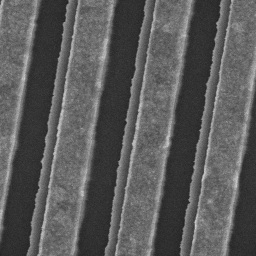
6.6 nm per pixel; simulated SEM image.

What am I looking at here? lines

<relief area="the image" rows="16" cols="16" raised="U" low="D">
UUDDUUUDDUUUDDUU
UUDDUUUDDUUUDDUU
UUDDUUUDDUUUDUUU
UUDDUUUDDUUDDUUU
UUDDUUDDUUUDDUUU
UDDUUUDDUUUDDUUU
UDDUUUDDUUUDDUUU
UDDUUUDDUUUDDUUD
UDDUUUDDUUUDUUUD
UDDUUUDDUUDDUUUD
UDDUUDDUUUDDUUUD
DDUUUDDUUUDDUUUD
DDUUUDDUUUDDUUUD
DDUUUDDUUUDDUUDD
DDUUUDDUUUDUUUDD
DDUUUDDUUDDUUUDD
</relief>